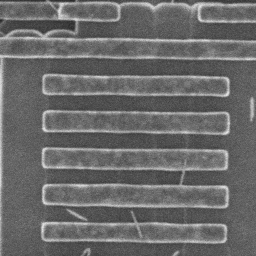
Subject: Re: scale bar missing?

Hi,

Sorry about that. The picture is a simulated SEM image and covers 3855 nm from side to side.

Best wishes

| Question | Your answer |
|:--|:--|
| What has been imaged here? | wiring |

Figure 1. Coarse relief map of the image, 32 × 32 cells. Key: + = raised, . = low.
........+++++++.................
.......++++++++..........+++++++
...........++++..........+++++++
................................
................................
++++++++++++++++++++++++++++++++
++++++++++++++++++++++++++++++++
................................
................................
......++++++....................
.....++++++++++++++++++++++++...
......+++++++++++++++++++++++...
................................
................................
.....++++++++++++++++++++++++...
.....++++++++++++++++++++++++...
..................++++++++++....
................................
................................
.....+++++++++++++++++++++++....
.....+++++++++++++++++++++++....
................................
................................
.....+++++++++++++++++++++++....
.....+++++++++++++++++++++++....
.......+++++++++++++++++++++....
................................
................................
.....+++++++++++++++++++++++....
.....+++++++++++++++++++++++....
................................
................................